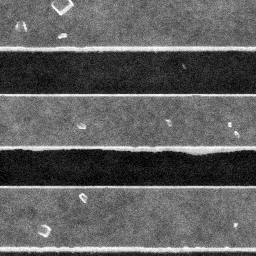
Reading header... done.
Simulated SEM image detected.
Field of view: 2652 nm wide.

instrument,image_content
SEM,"lines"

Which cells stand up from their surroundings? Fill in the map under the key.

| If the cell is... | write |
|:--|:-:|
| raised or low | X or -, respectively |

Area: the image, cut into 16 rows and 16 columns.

XXXXXXXXXXXXXXXX
XXXXXXXXXXXXXXXX
XXXXXXXXXXXXXXXX
----------------
----------------
----------------
XXXXXXXXXXXXXXXX
XXXXXXXXXXXXXXXX
XXXXXXXXXXXXXXXX
----------------
----------------
----------------
XXXXXXXXXXXXXXXX
XXXXXXXXXXXXXXXX
XXXXXXXXXXXXXXXX
XXXXXXXXXXXXXXXX